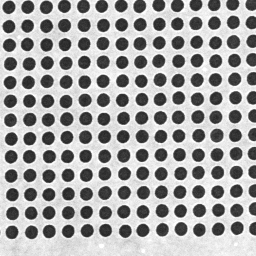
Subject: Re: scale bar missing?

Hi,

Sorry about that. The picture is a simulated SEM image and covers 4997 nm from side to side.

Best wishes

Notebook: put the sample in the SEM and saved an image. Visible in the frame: a regular array of holes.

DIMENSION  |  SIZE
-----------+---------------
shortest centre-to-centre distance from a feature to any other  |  355 nm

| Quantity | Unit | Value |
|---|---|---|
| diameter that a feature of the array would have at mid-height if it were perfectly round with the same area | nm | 269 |